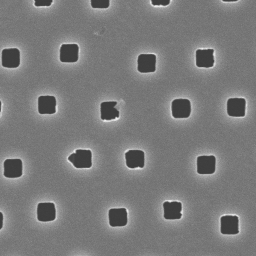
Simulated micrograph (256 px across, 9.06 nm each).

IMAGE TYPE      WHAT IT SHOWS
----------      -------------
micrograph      a regular array of holes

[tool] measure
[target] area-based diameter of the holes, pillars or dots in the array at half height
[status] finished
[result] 182 nm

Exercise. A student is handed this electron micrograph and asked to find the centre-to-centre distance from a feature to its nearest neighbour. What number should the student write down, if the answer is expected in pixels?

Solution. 55.4